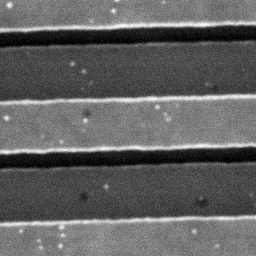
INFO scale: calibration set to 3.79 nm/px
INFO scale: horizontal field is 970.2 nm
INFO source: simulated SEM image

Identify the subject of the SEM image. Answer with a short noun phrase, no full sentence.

lines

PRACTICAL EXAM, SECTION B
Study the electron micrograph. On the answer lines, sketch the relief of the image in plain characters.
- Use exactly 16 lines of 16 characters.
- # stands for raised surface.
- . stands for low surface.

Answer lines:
################
################
................
................
................
................
################
################
################
###.............
................
................
................
................
################
################